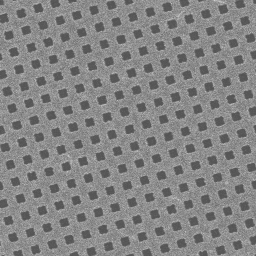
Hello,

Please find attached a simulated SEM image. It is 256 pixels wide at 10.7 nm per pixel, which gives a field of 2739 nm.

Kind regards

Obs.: a regular array of holes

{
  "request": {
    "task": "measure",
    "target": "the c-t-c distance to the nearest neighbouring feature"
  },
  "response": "187 nanometers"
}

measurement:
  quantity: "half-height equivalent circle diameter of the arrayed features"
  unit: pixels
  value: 9.9